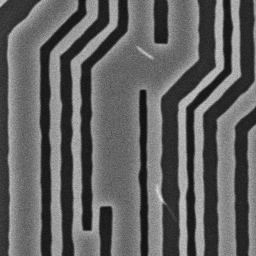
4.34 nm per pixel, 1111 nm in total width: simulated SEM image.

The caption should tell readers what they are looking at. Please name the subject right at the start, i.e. groups of lines, slits or small figures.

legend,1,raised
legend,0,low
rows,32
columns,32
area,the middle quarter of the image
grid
00110001111111111111111111111111
00110001111111111111111111111110
00110001111111111111111111111100
00110001111111111111111111111000
00110001111111111111111111110000
00110001111111111111111111100000
00110001111111111110111111000000
00110001111111111110011110000001
00110001111111111110011100000011
00110001111111111110011100000111
00110001111111111110011100000110
00110001111111111110011100000100
00110001111111111110011100000100
00110001111111111110011110001100
00110001111111111110011110000100
00110001111111111110011100000100
00110001111111111110011100000100
00110001111111111110011100000100
00110001111111111110011100000100
00110001111111111110011100000100
00110001111111111110011100000100
00110001111111111110011100000100
00110001111111111110011100000110
00110001111111111110011100000110
00110001111111111110011100000110
00110001111111111110011100000110
00110001111111111110011100000110
00110001111111111110011110000110
00110001111111111110011110000110
00110001111111111110011100000110
00110001111111111110011100000110
00110001111111111110011100000110